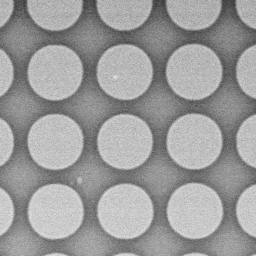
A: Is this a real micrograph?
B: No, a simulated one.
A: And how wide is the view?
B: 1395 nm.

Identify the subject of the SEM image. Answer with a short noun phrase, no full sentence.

an array of small figures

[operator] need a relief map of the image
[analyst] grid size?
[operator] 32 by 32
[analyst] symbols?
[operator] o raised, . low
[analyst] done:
oo.ooooooo..ooooooo..ooooooo..oo
o...oooooo..ooooooo..oooooo...oo
o...oooooo...ooooo....ooooo...oo
......oo......ooo......oo.......
................................
................................
.....oooo....ooooo....ooooo....o
o...oooooo...oooooo..oooooo...oo
oo..oooooo..ooooooo..ooooooo..oo
oo..oooooo..ooooooo..ooooooo..oo
o...oooooo..ooooooo..oooooo...oo
o....oooo....ooooo....ooooo....o
................................
................................
......oo.......oo......oo.......
o...oooooo...ooooo....ooooo...oo
o...oooooo..ooooooo..ooooooo..oo
oo..oooooo..ooooooo..ooooooo..oo
oo..oooooo..ooooooo..ooooooo..oo
o...oooooo...oooooo..oooooo...oo
.....oooo.....oooo....oooo.....o
................................
................................
.....oooo.....ooo.....oooo.....o
o...oooooo...ooooo....ooooo...oo
oo..oooooo..ooooooo..ooooooo..oo
oo..oooooo..ooooooo..ooooooo..oo
oo..oooooo..ooooooo..ooooooo..oo
o...oooooo...ooooo....ooooo...oo
.....ooo......ooo......ooo......
................................
................................